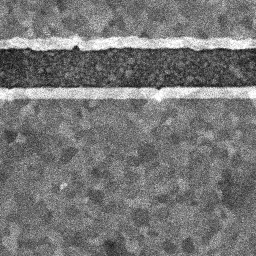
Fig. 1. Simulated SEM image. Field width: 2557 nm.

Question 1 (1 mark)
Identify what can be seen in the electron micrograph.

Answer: one or a few lines or trenches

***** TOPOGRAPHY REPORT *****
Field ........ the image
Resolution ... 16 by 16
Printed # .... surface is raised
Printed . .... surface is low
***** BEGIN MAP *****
################
################
################
................
................
................
################
################
################
################
################
################
################
################
################
################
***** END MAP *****